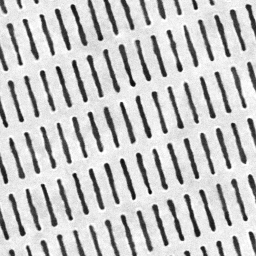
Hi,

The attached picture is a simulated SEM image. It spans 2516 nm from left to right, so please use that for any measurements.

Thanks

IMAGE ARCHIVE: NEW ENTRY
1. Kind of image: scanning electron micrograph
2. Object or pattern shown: a regular array of holes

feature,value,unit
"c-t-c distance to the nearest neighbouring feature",164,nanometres